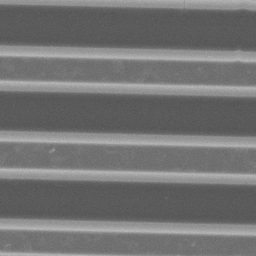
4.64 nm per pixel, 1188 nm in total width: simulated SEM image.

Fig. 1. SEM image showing one or a few lines or trenches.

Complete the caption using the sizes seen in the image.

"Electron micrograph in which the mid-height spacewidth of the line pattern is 0.227 um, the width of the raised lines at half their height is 175 nm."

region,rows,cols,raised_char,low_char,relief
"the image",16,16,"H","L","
LLLLLLLLLLLLLLLL
LLLLLLLLLLLLLLLL
LLLLLLLLLLLLLLLL
HHHHHHHHHHHHHHHH
HHHHHHHHHHHHHHHH
LLLLHHHHHHHHHHHH
LLLLLLLLLLLLLLLL
LLLLLLLLLLLLLLLL
LLLLLLLLLLLLLLLL
HHHHHHHHHHHHHHHH
HHHHHHHHHHHHHHHH
LLLLLLLLLLLLLLLL
LLLLLLLLLLLLLLLL
LLLLLLLLLLLLLLLL
HHHHHHHHHHHHHHHH
HHHHHHHHHHHHHHHH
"